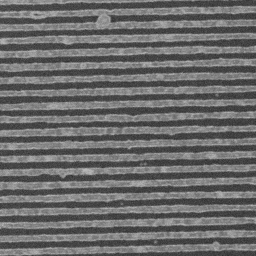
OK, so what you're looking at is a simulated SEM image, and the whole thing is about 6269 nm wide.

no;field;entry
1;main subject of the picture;parallel lines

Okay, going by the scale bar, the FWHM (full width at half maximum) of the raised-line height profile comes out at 0.138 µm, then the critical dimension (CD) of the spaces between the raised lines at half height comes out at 190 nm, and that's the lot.